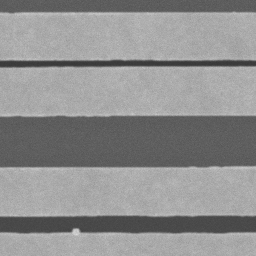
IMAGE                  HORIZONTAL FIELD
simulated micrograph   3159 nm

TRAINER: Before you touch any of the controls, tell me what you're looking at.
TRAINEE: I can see lines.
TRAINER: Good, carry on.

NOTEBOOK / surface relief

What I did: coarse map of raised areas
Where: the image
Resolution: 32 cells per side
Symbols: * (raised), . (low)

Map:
................................
................................
********************************
********************************
********************************
********************************
********************************
********************************
....****************************
********************************
********************************
********************************
********************************
********************************
******..******..................
................................
................................
................................
................................
................................
................................
********************************
********************************
********************************
********************************
********************************
********************************
................................
................................
********************************
********************************
********************************